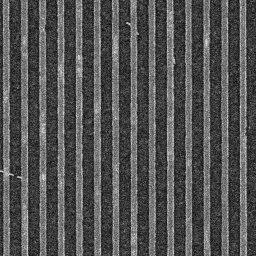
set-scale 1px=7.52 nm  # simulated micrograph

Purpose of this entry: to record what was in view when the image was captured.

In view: parallel lines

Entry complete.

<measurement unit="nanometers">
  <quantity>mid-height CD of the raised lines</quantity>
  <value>41.4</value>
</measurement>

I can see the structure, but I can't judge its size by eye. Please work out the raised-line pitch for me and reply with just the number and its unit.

18.2 px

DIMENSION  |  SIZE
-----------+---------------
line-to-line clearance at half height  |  94 nm